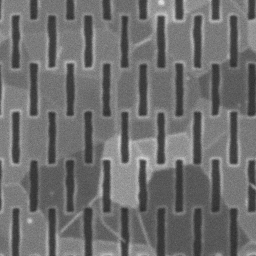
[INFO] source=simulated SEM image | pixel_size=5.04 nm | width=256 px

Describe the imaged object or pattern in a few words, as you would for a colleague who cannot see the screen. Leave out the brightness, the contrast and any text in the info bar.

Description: groups of lines, slits or small figures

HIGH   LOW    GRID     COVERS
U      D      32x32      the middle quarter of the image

DDDUUDDUUDDDUUDDUUUDDUUDDUUDDDUU
UDDUUUUUUDDDUUUUUUUDDUUUUUUUDDUU
UDDUUUUUUDDDUUUUUUUDDUUUUUUUDDUU
DDDUUUUUUDDDUUUUUUUDDUUUUUUUDDUU
DDDUUUUUUDDDUUUUUUUDDUUUUUUUDDUU
DDDUUUUUUDDDUUUUUUUDDUUUUUUUDDUU
DDDUUUUUUDDDUUUUUUUDDUUUUUUUDDUU
UDDUUUUUUDDDUUUUUUUDDUUUUUUUDDUU
UDDUUUUUUDDDUUUUUUUDDUUUUUUUDDUU
UDDUUUUUUDDDUUUUUUUDDUUUUUUUDDUU
UDDUUUUUUDDDUUUUUUDDDUUUUUUUDDUU
UDDUUUUUUDDDUUUUUUDDDUUUUUUUDDUU
DDDUUDDUUDDDUUDDDUDDDUUDDUUUDDUU
UUUUUDDUUUUUUUDDUUUUUUUDDUUUUUUU
UUUUUDDUUUUUUUDDUUUUUUUDDDUUUUUU
UUUUUDDUUUUUUUDDUUUUUUUDDUUUUUUU
UUUUUDDUUUUUUUDDUUUUUUUDDUUUUUUU
UUUUUDDUUUUUUUDDUUUUUUUDDUUUUUUU
UUUUUDDUUUUUUUDDDUUUUUUDDUUUUUUU
UUUUUDDUUUUUUUDDDUUUUUUDDUUUUUUU
UUUUUDDUUUUUUUDDDUUUUUUDDUUUUUUU
UUUUUDDUUUUUUUDDDUUUUUUDDUUUUUUU
UUUUUDDUUUUUUUDDDUUUUUUDDUUUUUUU
UUUUUDDUUUUUUUDDDUUUUUUDDUUUUUUU
DDDUUDDUUDDDUUDDUUDDDUUDDUUUDDUU
DDDUUUUUUDDDUUUUUUUDDUUUUUUUDDUU
UDDUUUUUUUDDUUUUUUDDDUUUUUUUDDUU
UDDUUUUUUUDDUUUUUUDDDUUUUUUUDDUU
DDDUUUUUUUDDUUUUUUDDDUUUUUUUDDUU
DDDUUUUUUUDDUUUUUUDDDUUUUUUUDDUU
DDDUUUUUUDDDUUUUUUUDDUUUUUUUDDUU
DDDUUUUUUDDDUUUUUUUDDUUUUUUUDDUU